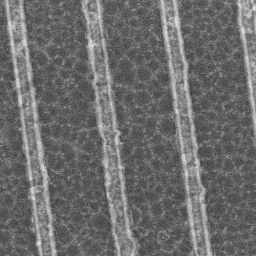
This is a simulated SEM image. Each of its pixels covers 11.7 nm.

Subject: one or a few lines or trenches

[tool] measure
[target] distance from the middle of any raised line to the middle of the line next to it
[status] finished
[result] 903 nm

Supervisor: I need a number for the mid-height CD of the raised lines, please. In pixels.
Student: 13.4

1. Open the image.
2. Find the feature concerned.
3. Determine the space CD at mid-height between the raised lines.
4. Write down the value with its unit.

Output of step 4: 750 nm